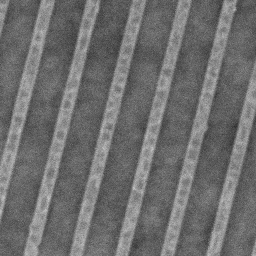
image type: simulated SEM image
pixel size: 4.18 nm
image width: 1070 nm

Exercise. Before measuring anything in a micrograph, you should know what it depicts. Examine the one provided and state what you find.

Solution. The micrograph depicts parallel lines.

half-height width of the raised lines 0.0472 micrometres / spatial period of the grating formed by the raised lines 44.4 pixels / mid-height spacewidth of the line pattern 137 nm